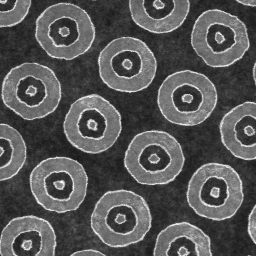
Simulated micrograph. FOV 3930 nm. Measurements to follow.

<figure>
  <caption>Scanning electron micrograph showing a regular array of ring-shaped raised bodies with a dot in the middle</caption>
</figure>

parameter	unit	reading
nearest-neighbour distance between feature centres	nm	1050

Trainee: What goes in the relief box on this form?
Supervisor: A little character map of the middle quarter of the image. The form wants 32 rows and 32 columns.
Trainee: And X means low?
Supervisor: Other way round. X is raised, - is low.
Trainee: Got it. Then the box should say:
---------XXX---XX--XXXX---------
---------XXX-------XXXX---------
---------XXXX-----XXXXX----XXXXX
---------XXXXXXXXXXXXX----XXXXXX
----------XXXXXXXXXXXX---XXXXXXX
-----------XXXXXXXXXX---XXXXX---
-------------XXXXXX-----XXXX----
------------------------XXX---X-
-----XXXX--------------XXXX---XX
---XXXXXXXX------------XXXX-----
--XXXXXXXXXX------------XXXX----
-XXXXX--XXXXX-----------XXXXX---
-XXXX----XXXXX-----------XXXXXXX
XXXX------XXXX------------XXXXXX
XXXX--XX--XXXX-------------XXXXX
XXXX--XX---XXX------------------
XXXX------XXXX------------------
XXXX------XXXX-----XXXXXXX------
-XXXXXXX-XXXX-----XXXXXXXXX-----
--XXXXXXXXXXX----XXXXXXXXXXX----
---XXXXXXXXX----XXXXX---XXXXX---
----XXXXXX------XXXX-----XXXX---
---------------XXXX-------XXXX--
X--------------XXXX--XXX---XXX--
XXXX-----------XXXX---X---XXXX--
XXXX-----------XXXX-------XXXX--
XXXXX-----------XXXXX----XXXX---
-XXXX------------XXXXXXXXXXX----
--XXXX------------XXXXXXXXXX----
--XXXX-------------XXXXXXX------
--XXXX-------------------------X
--XXXX-------------------------X